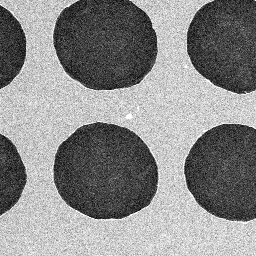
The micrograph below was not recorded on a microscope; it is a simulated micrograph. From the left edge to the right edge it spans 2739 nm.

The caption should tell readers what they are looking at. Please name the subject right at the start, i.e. holes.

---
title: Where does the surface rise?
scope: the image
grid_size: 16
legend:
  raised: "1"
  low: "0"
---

1111000001111000
0110000000110000
0010000000110000
0011000000110000
0111000001110000
1111110011111100
1111111111111111
1111111111111111
1111000001111000
0111000001110000
0010000000110000
0010000000110000
0111000000110000
1111100011111000
1111111111111111
1111111111111111